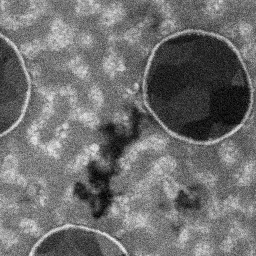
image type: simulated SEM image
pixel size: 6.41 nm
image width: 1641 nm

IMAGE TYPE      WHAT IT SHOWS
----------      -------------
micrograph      raised bodies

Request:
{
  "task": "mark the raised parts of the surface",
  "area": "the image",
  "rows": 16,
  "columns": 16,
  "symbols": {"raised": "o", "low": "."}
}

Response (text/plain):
................
................
o.........oooo..
o........oooooo.
oo.......oooooo.
oo.......ooooooo
oo.......ooooooo
o.........ooooo.
...........ooo..
................
................
................
................
................
...ooo..........
..oooooo........